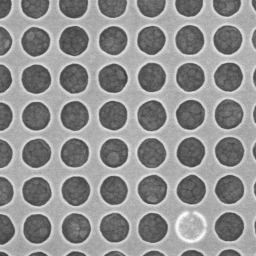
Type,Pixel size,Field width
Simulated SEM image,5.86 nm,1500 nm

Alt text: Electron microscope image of a regular array of holes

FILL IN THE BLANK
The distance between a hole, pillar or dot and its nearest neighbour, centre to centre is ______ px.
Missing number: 37.3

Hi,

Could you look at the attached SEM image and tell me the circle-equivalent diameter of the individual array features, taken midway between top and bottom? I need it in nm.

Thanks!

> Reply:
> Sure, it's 172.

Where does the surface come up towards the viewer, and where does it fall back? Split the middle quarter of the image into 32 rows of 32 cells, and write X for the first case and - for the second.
X----XXXXX----XXXXXX----XXXXX---
------XXX------XXXX------XXX----
------XXX-------XXX------XXX----
------XX--------XX--------XX----
------XXX-------XXX------XXX----
------XXX------XXXX------XXXX---
-----XXXXX-----XXXXX----XXXXXX--
XX-XXXXXXXXXXXXXXXXXXXXXXXXXXXXX
XXXXXXXXXXXXXXXXXXXXXXXXXXXXXXXX
XX--XXXXXXX---XXXXXXX---XXXXXX--
-----XXXXX-----XXXX------XXXX---
------XXX-------XX-------XXX----
------XXX-------XX--------XX----
------XXX-------XX--------XX----
------XXX-------XXX------XXX----
-----XXXX------XXXX------XXXX---
X---XXXXXXXX-XXXXXXX----XXXXXXX-
XXXXXXXXXXXXXXXXXXXXXXXXXXXXXXXX
XX-XXXXXXXXXXXXXXXXXXXXXXXXXXXX-
-----XXXXX-----XXXX-----XXXXX---
------XXX-------XXX------XXXX---
------XXX-------XX-------XXX----
------XXX-------XX--------XX----
------XXX-------XXX------XXX----
------XXXX-----XXXX------XXXX---
X---XXXXXXX---XXXXXX----XXXXXX--
XXXXXXXXXXXXXXXXXXXXXXXXXXXXXXXX
XXXXXXXXXXXXXXXXXXXXXXXXXXXXXXXX
X----XXXXXX---XXXXXX----XXXXXX--
------XXXX-----XXXX------XXXX---
------XXX-------XX--------XX----
-------XX-------XX--------XX----